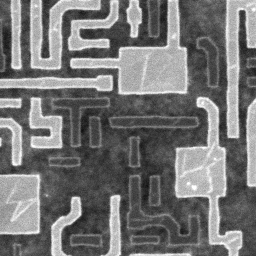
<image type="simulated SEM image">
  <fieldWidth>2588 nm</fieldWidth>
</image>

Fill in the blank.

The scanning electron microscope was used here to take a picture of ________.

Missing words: wiring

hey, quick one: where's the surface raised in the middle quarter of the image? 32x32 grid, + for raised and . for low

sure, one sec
..+++++++++++++++++++++++++++++.
..............+++++++++++++++++.
..............+++++++++++++++++.
........++++..+++++++++++++++++.
++++++++++++..+++++++++++++++++.
++++++++++++..+++++++++++++++++.
.........+++..+++++++++++++++++.
................................
.........++.....................
+++++++++++.....................
+++++++++++.....................
.+++............................
..++............................
..++..+++...++++++++++++++++++++
..++..+++...++++++++++++++++++++
..++..+++...++++++++++++++++++++
..++...++.......................
..++...++.......................
..++...++........++.............
..++...++........++.............
..++...++........++.............
.................++.........++++
................+++.........++++
++++............+++.........++++
++++............+++.........++++
+++.............+++.........++++
............................++++
............................++++
................+++...++....++++
................+++...++....++++
................+++...++....++++
................+++..+++....++++